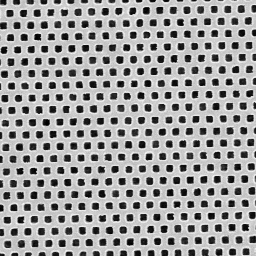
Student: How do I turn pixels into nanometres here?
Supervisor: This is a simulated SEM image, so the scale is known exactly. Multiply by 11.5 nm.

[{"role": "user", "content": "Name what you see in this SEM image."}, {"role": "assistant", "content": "a regular array of holes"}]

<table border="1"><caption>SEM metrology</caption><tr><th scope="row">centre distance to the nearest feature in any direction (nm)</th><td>153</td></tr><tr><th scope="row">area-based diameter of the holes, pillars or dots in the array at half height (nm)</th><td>91.7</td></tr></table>